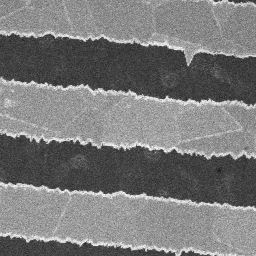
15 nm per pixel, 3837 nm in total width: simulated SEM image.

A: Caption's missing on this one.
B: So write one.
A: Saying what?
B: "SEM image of one or a few lines or trenches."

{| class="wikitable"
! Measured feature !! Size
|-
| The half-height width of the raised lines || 761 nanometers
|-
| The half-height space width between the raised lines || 747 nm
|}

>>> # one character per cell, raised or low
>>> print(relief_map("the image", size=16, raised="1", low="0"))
1111111111111111
1111111111111111
0000000111111111
0000000000000000
0000000000000000
1111100000000000
1111111111111110
1111111111111111
0011111111111111
0000000000011111
0000000000000000
0000000000000000
1111111111100000
1111111111111111
1111111111111111
0000000001111111